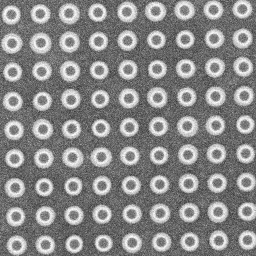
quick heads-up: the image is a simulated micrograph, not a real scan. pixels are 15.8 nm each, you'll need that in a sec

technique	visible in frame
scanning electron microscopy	an array of small figures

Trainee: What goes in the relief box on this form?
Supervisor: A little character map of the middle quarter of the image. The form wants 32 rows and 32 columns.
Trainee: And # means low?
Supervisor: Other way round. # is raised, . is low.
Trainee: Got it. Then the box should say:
####...####...####...#####..####
####...####...####...#####..####
####...####...####...####...####
###.....##.....##.....##........
................................
................................
.##............##.....###....###
####...####...####...#####..####
####...####...#####..#####..####
####...####...####...#####...###
###.....##.....###....###.....#.
................................
................................
.......................##....###
###.....###...####....####...###
####...####...#####..#####..####
####...####...#####..#####...###
####....###....###....###....###
.##.............................
................................
..............................##
.###....###....###....####...###
#####..#####..#####...####...###
#####..#####..#####...####...###
#####..#####...###....###....###
.###....##......................
................................
................................
..#.....###....###....####...###
.###...#####...####...####...###
####...#####...####...####...###
####....###....####...####...###